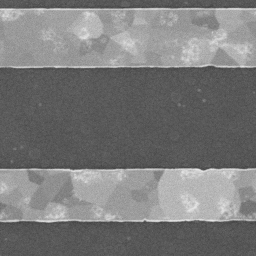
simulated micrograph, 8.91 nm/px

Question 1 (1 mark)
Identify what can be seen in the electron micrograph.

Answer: one or a few lines or trenches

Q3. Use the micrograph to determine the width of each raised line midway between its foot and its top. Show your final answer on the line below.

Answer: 485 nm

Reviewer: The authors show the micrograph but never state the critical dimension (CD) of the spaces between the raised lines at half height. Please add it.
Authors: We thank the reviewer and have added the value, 103 px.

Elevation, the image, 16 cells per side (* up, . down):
................
****************
****************
****************
................
................
................
................
................
................
................
****************
****************
****************
................
................